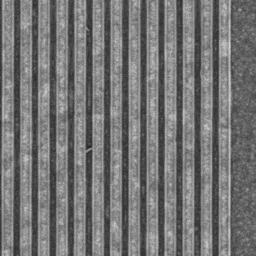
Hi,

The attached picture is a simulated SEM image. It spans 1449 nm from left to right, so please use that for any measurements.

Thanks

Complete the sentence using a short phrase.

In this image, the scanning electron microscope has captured parallel lines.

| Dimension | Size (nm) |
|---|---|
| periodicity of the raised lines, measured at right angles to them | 102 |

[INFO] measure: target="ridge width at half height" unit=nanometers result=57.3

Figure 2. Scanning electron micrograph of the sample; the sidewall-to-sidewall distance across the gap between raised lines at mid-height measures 43.1 nanometers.